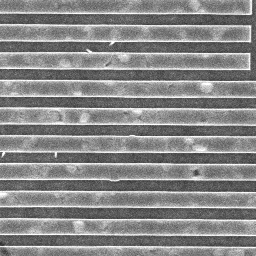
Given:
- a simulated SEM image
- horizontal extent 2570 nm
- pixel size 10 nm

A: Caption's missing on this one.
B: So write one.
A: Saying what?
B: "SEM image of parallel lines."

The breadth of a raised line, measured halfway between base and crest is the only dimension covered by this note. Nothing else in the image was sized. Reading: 167 nanometers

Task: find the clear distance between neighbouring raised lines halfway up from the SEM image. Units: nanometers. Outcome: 112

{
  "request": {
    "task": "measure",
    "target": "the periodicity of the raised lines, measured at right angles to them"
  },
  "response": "277 nanometres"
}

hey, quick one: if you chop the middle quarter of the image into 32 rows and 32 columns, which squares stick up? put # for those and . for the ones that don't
##########.#####################
................................
................................
................................
################################
################################
################################
################################
................................
................................
................................
################################
###############.################
##################.#############
################################
................................
................................
................................
################################
################################
################################
################################
................................
................................
................................
################################
###.############################
################################
################################
................................
................................
................................